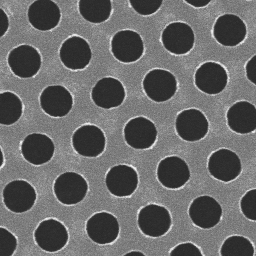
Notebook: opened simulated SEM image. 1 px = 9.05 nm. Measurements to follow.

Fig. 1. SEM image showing a regular array of holes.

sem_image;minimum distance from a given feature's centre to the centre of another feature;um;0.46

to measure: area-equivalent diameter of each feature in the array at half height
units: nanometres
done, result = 292